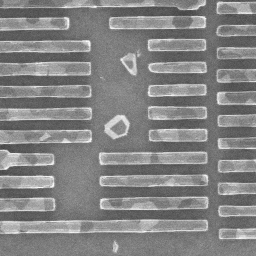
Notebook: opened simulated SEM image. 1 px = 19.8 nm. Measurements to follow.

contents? wiring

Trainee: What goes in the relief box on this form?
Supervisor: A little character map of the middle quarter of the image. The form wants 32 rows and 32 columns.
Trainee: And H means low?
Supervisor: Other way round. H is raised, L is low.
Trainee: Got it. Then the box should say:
HHHHHHHLLLLLLLLHHHLLLHHHHHHHHHHH
HHHHHHHLLLLLLLLLHHLLLLHHHHHHHHHH
HHHHHHLLLLLLLLLLLLLLLLLLLLLLLLLL
LLLLLLLLLLLLLLLLLLLLLLLLLLLLLLLL
LLLLLLLLLLLLLLLLLLLLLLLLLLLLLLLL
HHHHHHLLLLLLLLLLLLLLLLHHHHHHHHHH
HHHHHHHLLLLLLLLLLLLLLHHHHHHHHHHH
HHHHHHHLLLLLLLLLLLLLLHHHHHHHHHHH
LLLLLLLLLLLLLLLLLLLLLLLLLLLLLLLL
LLLLLLLLLLLLLLLLLLLLLLLLLLLLLLLL
LLLLLLLLLLLLLLLLLLLLLLLLLLLLLLLL
HHHHHHHLLLLLLLLLLLLLLHHHHHHHHHHH
HHHHHHHLLLLLLLLLLLLLLHHHHHHHHHHH
HHHHHHHLLLLLLHHLLLLLLHHHHHHHHHHH
LLLLLLLLLLLLHHHHLLLLLLLLLLLLLLLL
LLLLLLLLLLLHHHHHLLLLLLLLLLLLLLLL
LLLLLLLLLLLHHHHHLLLLLLLLLLHHHHHL
HHHHHHHLLLLLHHHLLLLLLHHHHHHHHHHH
HHHHHHHLLLLLLLLLLLLLLHHHHHHHHHHH
HHHHHHLLLLLLLLLLLLLLLLLLLLLLLLLL
LLLLLLLLLLLLLLLLLLLLLLLLLLLLLLLL
LLLLLLLLLLLLLLLLLLLLLLLLLLLLLLLL
LLLLLLLLLHHHHHHHHHHHHHHHHHHHHHHH
LLLLLLLLLHHHHHHHHHHHHHHHHHHHHHHH
LLLLLLLLLHHHHHHHHHHHHHHHHHHHHHHH
LLLLLLLLLLLLLLLLLLLLLLLLLLLLLLLL
LLLLLLLLLLLLLLLLLLLLLLLLLLLLLLLL
LLLLLLLLLLLLLLLLLLLLLLLLLLLLLLLL
LLLLLLLLLHHHHHHHHHHHHHHHHHHHHHHH
LLLLLLLLLHHHHHHHHHHHHHHHHHHHHHHH
LLLLLLLLLLLHHHHHHHHHHHHLLLLLLLLL
LLLLLLLLLLLLLLLLLLLLLLLLLLLLLLLL